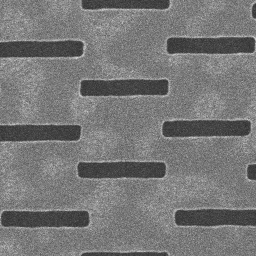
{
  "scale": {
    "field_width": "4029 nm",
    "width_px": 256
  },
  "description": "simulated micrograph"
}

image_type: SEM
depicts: holes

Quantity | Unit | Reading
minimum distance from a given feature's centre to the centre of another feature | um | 1.35